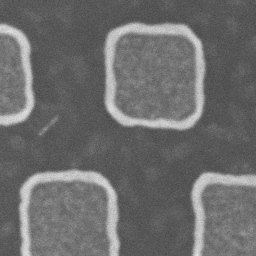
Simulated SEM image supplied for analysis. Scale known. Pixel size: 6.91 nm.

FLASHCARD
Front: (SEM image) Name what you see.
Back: raised bodies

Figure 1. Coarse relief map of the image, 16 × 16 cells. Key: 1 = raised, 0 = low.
0000000000000000
0000000000000000
1000000111110000
1100000111110000
1100000111111000
1100000111111000
1100000111111000
0000000011110000
0000000000000000
0000000000000000
0000000000000000
0011111000000111
0011111000001111
0111111000001111
0011111000001111
0011111000001111